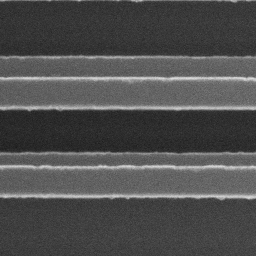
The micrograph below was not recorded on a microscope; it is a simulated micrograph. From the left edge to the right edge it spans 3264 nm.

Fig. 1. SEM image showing lines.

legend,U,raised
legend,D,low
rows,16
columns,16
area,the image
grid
DDDDDDDDDDDDDDDD
DDDDDDDDDDDDDDDD
DDDDDDDDDDDDDDDD
DDDDDDDDDDDDDDDD
UUUUUUUUUUUUUUUU
UUUUUUUUUUUUUUUU
UUUUUUUUUUUUUUUU
DDDDDDDDDDDDDDDD
DDDDDDDDDDDDDDDD
DDDDDDDDDDDDDDDD
UUUUUUUUUUUUUUUU
UUUUUUUUUUUUUUUU
DDDDDDDDDDDDDDDD
DDDDDDDDDDDDDDDD
DDDDDDDDDDDDDDDD
DDDDDDDDDDDDDDDD